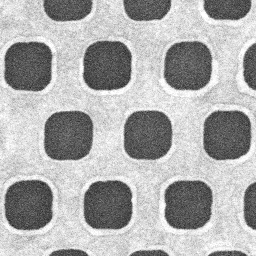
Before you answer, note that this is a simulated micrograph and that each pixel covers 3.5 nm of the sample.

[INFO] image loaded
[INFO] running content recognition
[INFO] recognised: a regular array of holes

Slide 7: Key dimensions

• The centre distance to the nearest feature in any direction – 277 nanometers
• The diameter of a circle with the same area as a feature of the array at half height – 0.187 um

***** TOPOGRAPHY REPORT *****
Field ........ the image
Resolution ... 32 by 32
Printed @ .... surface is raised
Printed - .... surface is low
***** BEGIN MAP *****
@@@@@-------@@@------@@@@------@
@@@@@@-----@@@@@-----@@@@@-----@
@@@@@@----@@@@@@----@@@@@@@---@@
@@@@@@@@@@@@@@@@@@@@@@@@@@@@@@@@
@@@@@@@@@@@@@@@@@@@@@@@@@@@@@@@@
@@----@@@@@-----@@@@@@----@@@@@-
@-----@@@@@-----@@@@@------@@@@-
-------@@@------@@@@-------@@@--
-------@@@------@@@@-------@@@--
-------@@@------@@@@-------@@@--
@-----@@@@@-----@@@@@-----@@@@@-
@@---@@@@@@@@@@@@@@@@@--@@@@@@@@
@@@@@@@@@@@@@@@@@@@@@@@@@@@@@@@@
@@@@@@@@@@@@@@@@@@@@@@@@@@@@@@@@
@@@@@@-----@@@@@-----@@@@@-----@
@@@@@@------@@@-------@@@------@
@@@@@-------@@@-------@@@-------
@@@@@-------@@@-------@@@-------
@@@@@------@@@@------@@@@------@
@@@@@@-----@@@@@-----@@@@@----@@
@@@@@@@@@@@@@@@@@@@@@@@@@@@@@@@@
@@@@@@@@@@@@@@@@@@@@@@@@@@@@@@@@
@@---@@@@@@@@--@@@@@@@---@@@@@@@
@-----@@@@@-----@@@@@-----@@@@@-
-------@@@@------@@@-------@@@--
-------@@@-------@@@@------@@@--
-------@@@-------@@@-------@@@--
@-----@@@@@-----@@@@@-----@@@@--
@@----@@@@@-----@@@@@----@@@@@@-
@@@@@@@@@@@@@@@@@@@@@@@@@@@@@@@@
@@@@@@@@@@@@@@@@@@@@@@@@@@@@@@@@
@@@@@@-----@@@@@@----@@@@@----@@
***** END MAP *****